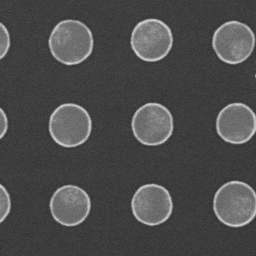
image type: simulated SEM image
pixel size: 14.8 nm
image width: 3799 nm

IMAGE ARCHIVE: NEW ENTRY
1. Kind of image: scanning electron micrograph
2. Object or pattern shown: a regular array of raised bodies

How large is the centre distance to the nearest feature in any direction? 1190 nanometres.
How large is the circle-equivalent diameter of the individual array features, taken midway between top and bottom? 0.597 µm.